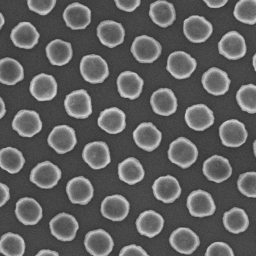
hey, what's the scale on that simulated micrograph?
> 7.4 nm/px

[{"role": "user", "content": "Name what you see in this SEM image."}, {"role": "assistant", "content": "a regular array of raised bodies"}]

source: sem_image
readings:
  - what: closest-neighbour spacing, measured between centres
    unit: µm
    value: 0.283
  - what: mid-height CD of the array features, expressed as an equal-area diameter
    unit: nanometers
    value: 197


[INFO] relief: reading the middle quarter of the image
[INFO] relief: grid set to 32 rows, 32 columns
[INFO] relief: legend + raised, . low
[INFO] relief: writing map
....+++++++...............++++++
....+++++++...............++++++
.....++++++...++++.........+++++
.....+++++....+++++..........+..
.......+.....+++++++............
.............++++++.............
..............+++++.....++......
..++++........+++++...+++++.....
.+++++..........+.....++++++....
+++++++...............++++++....
.++++++...............++++++....
.++++++....+++.........+++++...+
.+++++...++++++.........+++...++
.........++++++...............++
........+++++++................+
.........++++++....+++.........+
++........+++++...+++++.........
+++..............+++++++........
+++..............+++++++........
+++....+..........++++++...++++.
++....+++++........++++....+++++
++...++++++...............++++++
.....++++++...............++++++
.....++++++...............++++++
......+++++....+++.........+++++
.......+++....+++++..........++.
..............++++++............
..............++++++............
...++.........++++++....++++....
.+++++.........+++.....+++++....
.++++++...............+++++++...
.++++++...............+++++++...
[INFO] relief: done